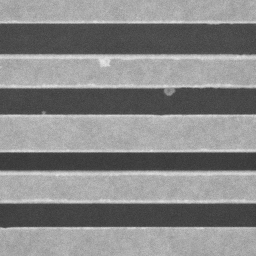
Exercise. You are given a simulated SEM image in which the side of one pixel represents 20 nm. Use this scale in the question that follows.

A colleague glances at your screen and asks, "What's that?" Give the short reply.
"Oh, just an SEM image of lines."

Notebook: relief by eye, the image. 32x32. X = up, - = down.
XXXXXXXXXXXXXXXXXXXXXXXXXXXXXXXX
XXXXXXXXXXXXXXXXXXXXXXXXXXXXXXXX
XXXXXXXXXXXXXXXXXXXXXXXXXXXXXXXX
--------------------------------
--------------------------------
--------------------------------
--------------------------------
XXXXXXXXXXXXXXXXXXXXXXXXXXXXXXXX
XXXXXXXXXXXXXXXXXXXXXXXXXXXXXXXX
XXXXXXXXXXXXXXXXXXXXXXXXXXXXXXXX
XXXXXXXXXXXXXXXXXXXXXXXXXXXXXXXX
--------------------------------
--------------------------------
--------------------------------
XXXXXXXXXXXXXXXXXXXXXXXXXXXXXXXX
XXXXXXXXXXXXXXXXXXXXXXXXXXXXXXXX
XXXXXXXXXXXXXXXXXXXXXXXXXXXXXXXX
XXXXXXXXXXXXXXXXXXXXXXXXXXXXXXXX
XXXXXXXXXXXXXXXXXXXXXXXXXXXXXXXX
--------------------------------
--------------------------------
XXXXXXXXXXXXXXXXXXXXXXXXXXXXXXXX
XXXXXXXXXXXXXXXXXXXXXXXXXXXXXXXX
XXXXXXXXXXXXXXXXXXXXXXXXXXXXXXXX
XXXXXXXXXXXXXXXXXXXXXXXXXXXXXXXX
--------------------------------
--------------------------------
--------------------------------
XXXXXXXXXXXXXXXXXXXXXXXXXXXXXXXX
XXXXXXXXXXXXXXXXXXXXXXXXXXXXXXXX
XXXXXXXXXXXXXXXXXXXXXXXXXXXXXXXX
XXXXXXXXXXXXXXXXXXXXXXXXXXXXXXXX